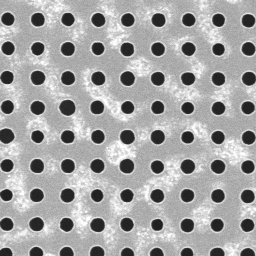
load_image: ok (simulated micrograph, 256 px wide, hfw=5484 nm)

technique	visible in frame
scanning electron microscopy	a regular array of holes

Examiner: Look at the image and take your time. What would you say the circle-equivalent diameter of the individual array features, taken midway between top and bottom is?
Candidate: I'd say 303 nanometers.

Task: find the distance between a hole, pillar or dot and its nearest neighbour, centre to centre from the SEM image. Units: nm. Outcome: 623